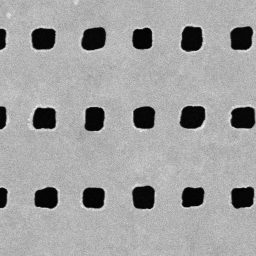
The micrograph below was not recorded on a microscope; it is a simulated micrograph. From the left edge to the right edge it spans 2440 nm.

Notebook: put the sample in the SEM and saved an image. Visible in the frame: a regular array of holes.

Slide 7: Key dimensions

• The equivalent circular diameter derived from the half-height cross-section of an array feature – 225 nm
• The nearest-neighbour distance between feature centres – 465 nanometres